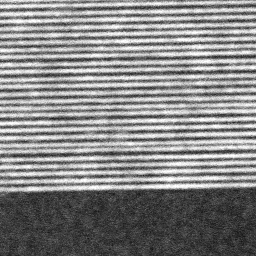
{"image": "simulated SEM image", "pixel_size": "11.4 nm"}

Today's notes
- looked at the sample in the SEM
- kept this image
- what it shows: parallel lines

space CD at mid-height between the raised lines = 44 nanometers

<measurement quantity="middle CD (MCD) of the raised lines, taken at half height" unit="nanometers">35.5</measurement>